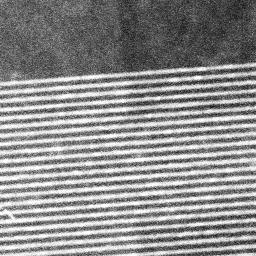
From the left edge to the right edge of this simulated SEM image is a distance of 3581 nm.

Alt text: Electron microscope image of parallel lines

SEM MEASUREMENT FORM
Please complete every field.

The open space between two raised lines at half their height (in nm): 85.5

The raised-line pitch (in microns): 0.12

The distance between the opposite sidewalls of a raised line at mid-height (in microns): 0.0384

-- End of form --